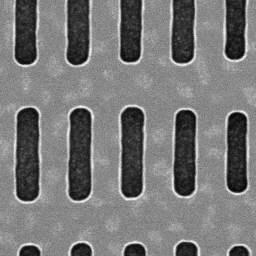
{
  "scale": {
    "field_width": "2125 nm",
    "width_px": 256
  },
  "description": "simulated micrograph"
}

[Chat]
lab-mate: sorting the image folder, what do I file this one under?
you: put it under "holes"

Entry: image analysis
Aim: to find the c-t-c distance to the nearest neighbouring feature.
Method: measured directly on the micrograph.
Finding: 433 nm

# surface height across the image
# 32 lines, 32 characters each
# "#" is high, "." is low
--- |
##...###...####...###...####...#
##...###...####...####..####...#
##...###...####...####..####...#
##...###...####...###...####...#
##...###...####...###...####...#
##...###...####...###...####...#
##...###...####...###...####...#
##..####...####..#####..#####.##
################################
################################
################################
################################
################################
###.############.###############
##...####..####...####..#####..#
##...####...###...####..####...#
##...####..####...####...###...#
##...####..####...####...###...#
##...####..####...####...###...#
##...####..####...####...###...#
##...###...####...####...###...#
##...###....###...####..####...#
##...####...###...####..####...#
##...####..####...####..#####..#
##...####..#####.###############
################################
################################
################################
################################
################################
##########.#####..####..########
##...####...###...####...####..#